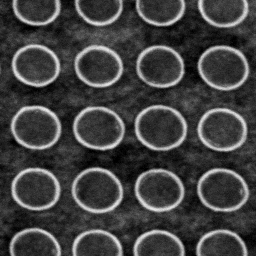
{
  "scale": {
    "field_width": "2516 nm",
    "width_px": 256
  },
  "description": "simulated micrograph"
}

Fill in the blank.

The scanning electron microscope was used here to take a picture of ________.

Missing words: a regular array of raised bodies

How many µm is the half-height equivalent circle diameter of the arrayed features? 0.426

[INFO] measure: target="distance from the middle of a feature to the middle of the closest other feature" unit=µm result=0.604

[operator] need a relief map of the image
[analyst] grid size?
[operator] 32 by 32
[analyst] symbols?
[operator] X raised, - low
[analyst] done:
--XXXXX---XXXXX--XXXXXX--XXXXXX-
--XXXXX---XXXXX--XXXXXX--XXXXXX-
---XXX-----XXX----XXXX----XXXX--
--------------------------------
--------------------------------
--------------------------------
--XXXX-----XXX----XXXX----XXXX--
--XXXXX---XXXXX--XXXXXX--XXXXXX-
--XXXXX---XXXXX--XXXXXX--XXXXXX-
--XXXXX---XXXXX---XXXXX--XXXXXX-
----X------XXX-----XX-----XXXX--
--------------------------------
--------------------------------
----X--------------XX-----------
--XXXXX---XXXX----XXXX----XXXX--
--XXXXX--XXXXXX--XXXXXX--XXXXX--
--XXXXX--XXXXXX--XXXXXX--XXXXXX-
--XXXXX---XXXXX---XXXXX--XXXXX--
-------------------XX------XX---
--------------------------------
--------------------------------
---XXX-----XX------XX------XX---
--XXXXX---XXXXX--XXXXX---XXXXX--
--XXXXX--XXXXXX--XXXXXX--XXXXXX-
--XXXXX--XXXXXX--XXXXXX--XXXXXX-
---XXX----XXXX----XXXX----XXXX--
--------------------------------
--------------------------------
--------------------------------
--XXXX----XXXX----XXX-----XXX---
--XXXXX--XXXXXX--XXXXXX--XXXXX--
-XXXXXX--XXXXXX--XXXXXX--XXXXXX-